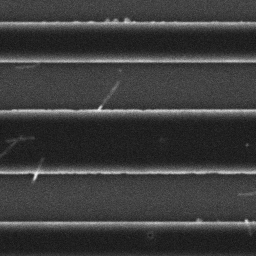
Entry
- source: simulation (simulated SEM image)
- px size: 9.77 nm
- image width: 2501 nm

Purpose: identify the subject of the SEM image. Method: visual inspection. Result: lines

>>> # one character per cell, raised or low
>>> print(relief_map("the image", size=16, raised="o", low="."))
................
oooooooooooooooo
oooooooooooooooo
oooooooooooooooo
................
................
................
oooooooooooooooo
oooooooooooooooo
oooooooooooooooo
oooooooooooooooo
................
................
................
oooooooooooooooo
oooooooooooooooo